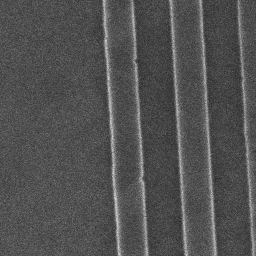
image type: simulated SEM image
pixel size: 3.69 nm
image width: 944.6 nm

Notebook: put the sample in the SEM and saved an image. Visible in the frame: one or a few lines or trenches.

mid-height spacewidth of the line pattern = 0.141 µm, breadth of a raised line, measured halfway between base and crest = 109 nm